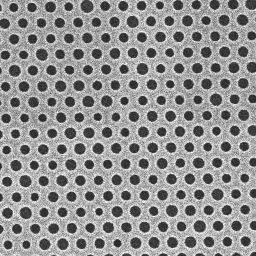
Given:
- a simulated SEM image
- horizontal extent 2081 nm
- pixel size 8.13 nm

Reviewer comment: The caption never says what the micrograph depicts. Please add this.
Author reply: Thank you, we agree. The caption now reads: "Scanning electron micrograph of a regular array of holes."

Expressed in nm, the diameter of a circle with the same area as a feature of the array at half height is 82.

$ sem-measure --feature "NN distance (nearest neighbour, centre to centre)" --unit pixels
18